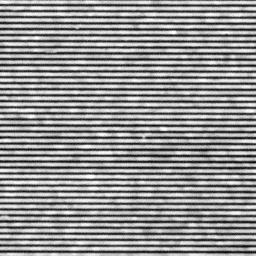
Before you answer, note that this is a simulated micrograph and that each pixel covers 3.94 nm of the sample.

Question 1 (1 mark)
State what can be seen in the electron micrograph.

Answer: parallel lines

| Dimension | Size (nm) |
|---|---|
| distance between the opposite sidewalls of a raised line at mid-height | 13.3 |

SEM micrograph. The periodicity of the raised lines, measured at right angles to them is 0.0237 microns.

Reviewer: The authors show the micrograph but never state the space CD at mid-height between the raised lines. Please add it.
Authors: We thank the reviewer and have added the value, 10.3 nm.